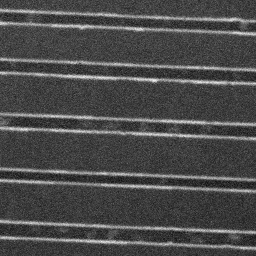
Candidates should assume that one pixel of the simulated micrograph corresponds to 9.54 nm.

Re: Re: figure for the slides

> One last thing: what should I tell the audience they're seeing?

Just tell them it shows parallel lines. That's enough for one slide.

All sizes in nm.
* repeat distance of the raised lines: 508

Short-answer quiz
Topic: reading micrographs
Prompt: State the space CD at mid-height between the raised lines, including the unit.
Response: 123 nm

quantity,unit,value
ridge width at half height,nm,403